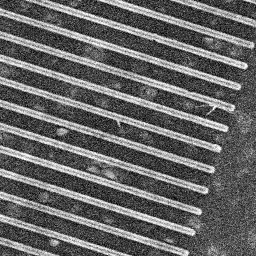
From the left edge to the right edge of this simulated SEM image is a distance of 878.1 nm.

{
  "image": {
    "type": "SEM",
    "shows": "parallel lines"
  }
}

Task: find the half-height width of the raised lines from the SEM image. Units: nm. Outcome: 15.5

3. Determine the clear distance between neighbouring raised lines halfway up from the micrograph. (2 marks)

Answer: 58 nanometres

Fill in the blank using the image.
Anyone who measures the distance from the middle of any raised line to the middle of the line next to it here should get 74.7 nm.